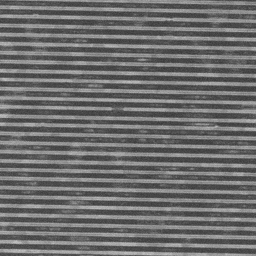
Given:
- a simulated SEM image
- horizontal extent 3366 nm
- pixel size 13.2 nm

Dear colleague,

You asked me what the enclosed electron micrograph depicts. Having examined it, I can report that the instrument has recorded parallel lines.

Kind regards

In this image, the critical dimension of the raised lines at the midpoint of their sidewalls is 31.2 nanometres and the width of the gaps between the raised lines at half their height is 83.8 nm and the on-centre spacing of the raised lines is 118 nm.